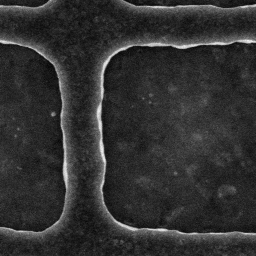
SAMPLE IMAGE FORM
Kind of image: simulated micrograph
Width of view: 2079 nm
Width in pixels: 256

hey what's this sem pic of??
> holes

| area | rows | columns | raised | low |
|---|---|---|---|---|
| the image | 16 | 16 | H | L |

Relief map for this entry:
HHHHHHHHHHHHHHHH
HHHHHHHHHHHHHHHH
HHHHHHHHHHHHHHHH
LLLHHHHLLLLLLLLL
LLLLHHLLLLLLLLLL
LLLLHHLLLLLLLLLL
LLLLHHLLLLLLLLLL
LLLLHHLLLLLLLLLL
LLLLHHLLLLLLLLLL
LLLLHHLLLLLLLLLL
LLLLHHHLLLLLLLLL
LLLLHHLLLLLLLLLL
LLLLHHHLLLLLLLLL
LLLLHHHLLLLLLLLL
HHHHHHHHHHHLLLLL
HHHHHHHHHHHHHHHH